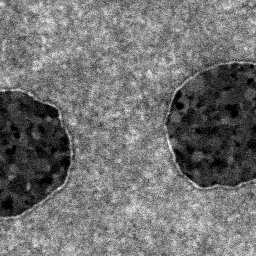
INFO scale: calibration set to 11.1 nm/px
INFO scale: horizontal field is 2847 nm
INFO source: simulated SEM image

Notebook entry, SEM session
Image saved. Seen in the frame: raised bodies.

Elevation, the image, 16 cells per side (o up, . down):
................
................
................
................
.............ooo
...........ooooo
ooo........ooooo
oooo......oooooo
oooo......oooooo
oooo.......ooooo
oooo.......ooooo
oooo........ooo.
ooo.............
o...............
................
................